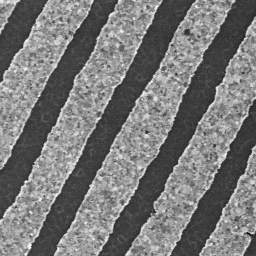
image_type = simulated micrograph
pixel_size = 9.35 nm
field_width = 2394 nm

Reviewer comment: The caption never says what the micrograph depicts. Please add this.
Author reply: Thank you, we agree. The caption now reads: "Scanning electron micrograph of one or a few lines or trenches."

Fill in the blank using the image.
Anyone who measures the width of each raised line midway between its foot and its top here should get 343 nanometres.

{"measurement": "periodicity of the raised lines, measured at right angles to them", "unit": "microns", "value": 0.593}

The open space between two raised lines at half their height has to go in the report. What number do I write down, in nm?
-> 248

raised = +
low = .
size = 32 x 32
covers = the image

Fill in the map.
++....+++++....+++++....+++++...
+....++++++...+++++.....++++....
+....+++++....+++++....+++++....
....++++++...+++++....+++++....+
....+++++...++++++....+++++....+
...+++++....+++++....+++++....++
..++++++....+++++....++++.....++
..+++++....+++++....+++++....+++
.++++++...++++++....++++....++++
.+++++....+++++....+++++....++++
++++++...++++++....+++++....++++
+++++....+++++....+++++....+++++
+++++....+++++...++++++....+++++
++++....+++++....+++++....+++++.
++++....+++++...++++++....+++++.
+++....+++++....+++++....+++++..
+++...+++++....++++++....+++++..
++....+++++...+++++++...+++++...
+....+++++....++++++...++++++...
+....+++++....+++++....+++++...+
....+++++....++++++...++++++...+
....+++++...++++++....+++++....+
....++++....+++++....++++++...++
...+++++...++++++....+++++....++
..+++++....+++++....+++++....+++
..++++....++++++...++++++....+++
.+++++....+++++....+++++....++++
+++++....+++++.....+++++....++++
+++++....+++++....+++++....+++++
+++++...++++++...+++++....+++++.
++++...++++++....+++++....+++++.
+++....+++++....+++++....+++++..